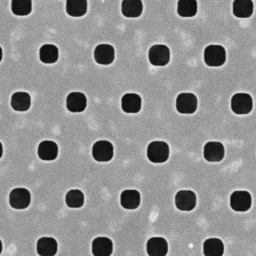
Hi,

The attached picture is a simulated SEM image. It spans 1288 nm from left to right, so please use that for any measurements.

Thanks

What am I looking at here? a regular array of holes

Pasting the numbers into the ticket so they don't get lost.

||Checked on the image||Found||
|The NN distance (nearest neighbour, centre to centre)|276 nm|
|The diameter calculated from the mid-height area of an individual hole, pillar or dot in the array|112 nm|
